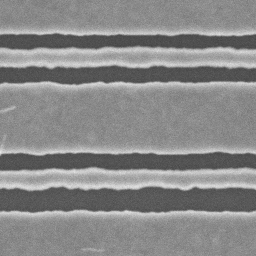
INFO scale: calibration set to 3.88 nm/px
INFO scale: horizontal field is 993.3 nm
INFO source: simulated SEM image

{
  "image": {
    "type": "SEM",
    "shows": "lines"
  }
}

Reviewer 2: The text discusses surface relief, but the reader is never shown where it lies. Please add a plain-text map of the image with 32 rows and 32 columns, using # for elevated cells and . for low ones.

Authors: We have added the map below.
################################
################################
################################
################################
................................
................................
################################
################################
................................
................................
########..######################
################################
################################
################################
################################
################################
################################
################################
################################
................................
................................
################################
################################
######..##########...###.###..##
................................
................................
###..############....#####..#..#
################################
################################
################################
################################
################################